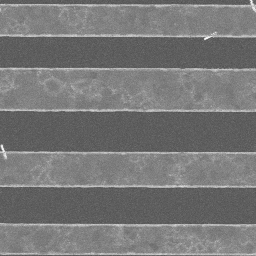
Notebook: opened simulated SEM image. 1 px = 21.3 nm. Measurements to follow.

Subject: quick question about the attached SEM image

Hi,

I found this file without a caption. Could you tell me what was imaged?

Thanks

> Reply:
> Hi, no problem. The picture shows one or a few lines or trenches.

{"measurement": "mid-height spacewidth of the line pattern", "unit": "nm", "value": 817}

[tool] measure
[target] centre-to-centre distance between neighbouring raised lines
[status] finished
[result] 1.55 microns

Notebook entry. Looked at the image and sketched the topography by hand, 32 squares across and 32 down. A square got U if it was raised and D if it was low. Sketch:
DDDDDDDDDDDDDDDDDDDDDDDDDDDDDDDD
UUUUUUUUUUUUUUUUUUUUUUUUUUUUUUUU
UUUUUUUUUUUUUUUUUUUUUUUUUUUUUUUU
UUUUUUUUUUUUUUUUUUUUUUUUUUUUUUUU
DDDDDDDDDDDDDUUUDDUDUUUUUUUDUUUU
DDDDDDDDDDDDDDDDDDDDDDDDDDDDDDDD
DDDDDDDDDDDDDDDDDDDDDDDDDDDDDDDD
DDDDDDDDDDDDDDDDDDDDDDDDDDDDDDDD
DDDDDDDDDDDDDDDDDDDDDDDDDDDDDDDD
UUUUUUUUUUUUUUUUUUUUUUUUUUUUUUUU
UUUUUUUUUUUUUUUUUUUUUUUUUUUUUUUU
UUUUUUUUUUUUUUUUUUUUUUUUUUUUUUUU
UUUUUUUUUUUUUUUUUUUUUUUUUUUUUUUU
UUUUUUUUUUUUUUUUUUUUUUUUUUUUUUUU
DDDDDDDDDDDDDDDDDDDDDDDDDDDDDDDD
DDDDDDDDDDDDDDDDDDDDDDDDDDDDDDDD
DDDDDDDDDDDDDDDDDDDDDDDDDDDDDDDD
DDDDDDDDDDDDDDDDDDDDDDDDDDDDDDDD
DDDDDDDDDDDDDDDDDDDDDDDDDDDDDDDD
UUUUUUUUUUUUUUUUUUUUUUUUUUUUUUUU
UUUUUUUUUUUUUUUUUUUUUUUUUUUUUUUU
UUUUUUUUUUUUUUUUUUUUUUUUUUUUUUUU
UUUUUUUUUUUUUUUUUUUUUUUUUUUUUUUU
DDDDDDDDDDDDDDDDDDDDDDDDDDDDDDDD
DDDDDDDDDDDDDDDDDDDDDDDDDDDDDDDD
DDDDDDDDDDDDDDDDDDDDDDDDDDDDDDDD
DDDDDDDDDDDDDDDDDDDDDDDDDDDDDDDD
DDDDDDDDDDDDDDDDDDDDDDDDDDDDDDDD
UUUUUUUUUUUUUUUUUUUUUUUUUUUUUUUU
UUUUUUUUUUUUUUUUUUUUUUUUUUUUUUUU
UUUUUUUUUUUUUUUUUUUUUUUUUUUUUUUU
UUUUUUUUUUUUUUUUUUUUUUUUUUUUUUUU